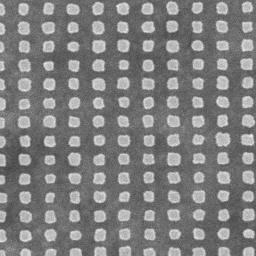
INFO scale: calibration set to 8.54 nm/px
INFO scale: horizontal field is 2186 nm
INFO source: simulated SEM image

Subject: a regular array of raised bodies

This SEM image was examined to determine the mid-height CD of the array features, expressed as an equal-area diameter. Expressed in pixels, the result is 11.3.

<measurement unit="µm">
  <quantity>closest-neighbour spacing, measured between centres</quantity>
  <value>0.159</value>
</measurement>